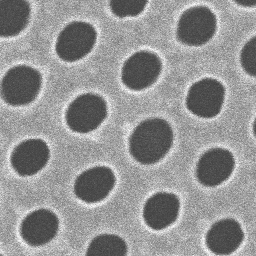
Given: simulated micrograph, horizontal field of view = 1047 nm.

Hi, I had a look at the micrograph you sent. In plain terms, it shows a regular array of holes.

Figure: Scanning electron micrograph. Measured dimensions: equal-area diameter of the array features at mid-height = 163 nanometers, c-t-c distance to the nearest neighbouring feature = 284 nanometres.